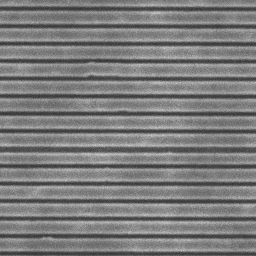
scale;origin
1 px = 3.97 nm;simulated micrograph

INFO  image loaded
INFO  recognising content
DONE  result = parallel lines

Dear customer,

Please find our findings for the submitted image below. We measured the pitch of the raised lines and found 0.0695 microns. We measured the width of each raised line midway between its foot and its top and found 50.7 nanometers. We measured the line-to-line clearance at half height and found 0.0189 µm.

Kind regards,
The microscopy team